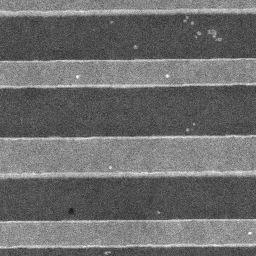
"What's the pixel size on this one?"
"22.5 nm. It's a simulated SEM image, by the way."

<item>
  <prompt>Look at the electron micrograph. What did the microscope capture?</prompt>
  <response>lines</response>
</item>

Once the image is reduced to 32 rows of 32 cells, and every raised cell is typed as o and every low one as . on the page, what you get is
oooooooooooooooooooooooooooooooo
.ooooo..........................
................................
................................
................................
................................
................................
....................oooooooooooo
oooooooooooooooooooooooooooooooo
oooooooooooooooooooooooooooooooo
oooooooooooooooooooooooooooooo.o
................................
................................
................................
................................
................................
................................
oooooooooooooooooooooooooooooooo
oooooooooooooooooooooooooooooooo
oooooooooooooooooooooooooooooooo
oooooooooooooooooooooooooooooooo
ooooooooooooooooooooooooooooooo.
................................
................................
................................
................................
................................
.......................ooooooooo
oooooooooooooooooooooooooooooooo
oooooooooooooooooooooooooooooooo
oooooooooooooooooooooooooooooooo
................................